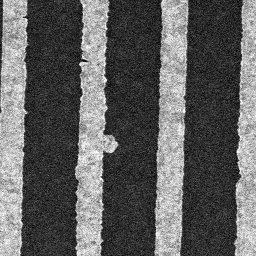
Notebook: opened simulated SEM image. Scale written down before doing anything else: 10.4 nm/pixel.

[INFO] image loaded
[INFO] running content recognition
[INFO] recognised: one or a few lines or trenches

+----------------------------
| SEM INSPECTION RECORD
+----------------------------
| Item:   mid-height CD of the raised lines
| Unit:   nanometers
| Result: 255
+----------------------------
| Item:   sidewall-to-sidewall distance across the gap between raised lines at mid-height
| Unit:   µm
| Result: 0.579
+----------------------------